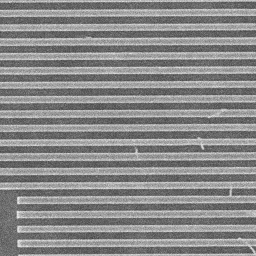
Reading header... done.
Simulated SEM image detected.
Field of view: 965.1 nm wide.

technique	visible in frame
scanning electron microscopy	parallel lines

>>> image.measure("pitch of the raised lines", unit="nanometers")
54.2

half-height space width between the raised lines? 28.7 nm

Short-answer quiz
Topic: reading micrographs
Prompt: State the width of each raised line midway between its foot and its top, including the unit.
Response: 6.74 px